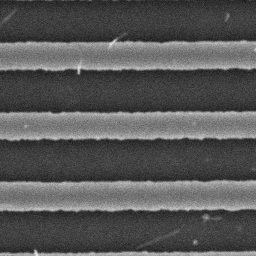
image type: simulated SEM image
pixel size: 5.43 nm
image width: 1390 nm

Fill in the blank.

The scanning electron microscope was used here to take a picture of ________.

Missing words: lines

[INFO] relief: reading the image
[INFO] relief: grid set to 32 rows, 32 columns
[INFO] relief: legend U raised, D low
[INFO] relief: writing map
DDDDDDDDDDDDDDDDDDDDDDDDDDDDDDDD
DDDDDDDDDDDDDDDDDDDDDDDDDDDDDDDD
DDDDDDDDDDDDDDDDDDDDDDDDDDDDDDDD
DDDDDDDDDDDDDDDDDDDDDDDDDDDDDDDD
DDDDDDDDDDDDDDDDDDDDDDDDDDDDDDDD
UUUUUUUUUUUUUUUUUUUUUUUUUUUUUUUU
UUUUUUUUUUUUUUUUUUUUUUUUUUUUUUUU
UUUUUUUUUUUUUUUUUUUUUUUUUUUUUUUU
UUUUUUUUUUUUUUUUUUUUUUUUUUUUUDUU
DDDDDDDDDDDDDDDDDDDDDDDDDDDDDDDD
DDDDDDDDDDDDDDDDDDDDDDDDDDDDDDDD
DDDDDDDDDDDDDDDDDDDDDDDDDDDDDDDD
DDDDDDDDDDDDDDDDDDDDDDDDDDDDDDDD
DDDDDDDDDDDDDDDDDDDDDDDDDDDDDDDD
UUUUUUUUUUUUUUUUUUUUUUUUUUUUUUUU
UUUUUUUUUUUUUUUUUUUUUUUUUUUUUUUU
UUUUUUUUUUUUUUUUUUUUUUUUUUUUUUUU
DUDDDDDDDDDDDDDDDDDDDDDDDDDDDDDD
DDDDDDDDDDDDDDDDDDDDDDDDDDDDDDDD
DDDDDDDDDDDDDDDDDDDDDDDDDDDDDDDD
DDDDDDDDDDDDDDDDDDDDDDDDDDDDDDDD
DDDDDDDDDDDDDDDDDDDDDDDDDDDDDDDD
DDDDDDDDDDDDDDDDDDDDDDDDDDDDDDDD
UUUUUUUUUUUUUUUUUUUUUUUUUUUUUUUU
UUUUUUUUUUUUUUUUUUUUUUUUUUUUUUUU
UUUUUUUUUUUUUUUUUUUUUUUUUUUUUUUU
DDDDDDDDDDDDDDDDDDDDDDDDDDDDDDDD
DDDDDDDDDDDDDDDDDDDDDDDDDDDDDDDD
DDDDDDDDDDDDDDDDDDDDDDDDDDDDDDDD
DDDDDDDDDDDDDDDDDDDDDDDDDDDDDDDD
DDDDDDDDDDDDDDDDDDDDDDDDDDDDDDDD
DDDDDDDDDDDDDDDDDDDDDDDDDDDDDDDD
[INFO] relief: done